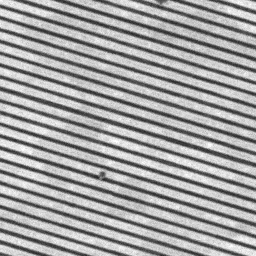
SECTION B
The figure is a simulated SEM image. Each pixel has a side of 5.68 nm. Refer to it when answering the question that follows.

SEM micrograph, parallel lines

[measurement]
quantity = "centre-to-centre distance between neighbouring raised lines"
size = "0.0641 microns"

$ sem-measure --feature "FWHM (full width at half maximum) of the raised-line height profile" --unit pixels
6.46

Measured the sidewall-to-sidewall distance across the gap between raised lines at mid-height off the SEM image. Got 0.0312 um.